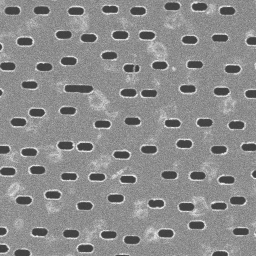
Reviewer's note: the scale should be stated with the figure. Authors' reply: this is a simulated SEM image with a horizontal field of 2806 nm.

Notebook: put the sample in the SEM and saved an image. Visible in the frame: a regular array of holes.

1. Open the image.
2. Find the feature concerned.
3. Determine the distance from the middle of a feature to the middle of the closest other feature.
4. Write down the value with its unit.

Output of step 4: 274 nanometres